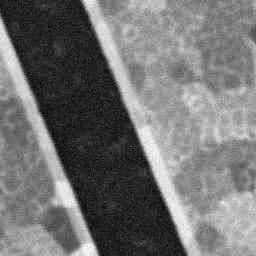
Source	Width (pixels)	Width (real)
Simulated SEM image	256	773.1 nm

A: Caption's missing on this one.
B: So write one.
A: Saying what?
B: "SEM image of one or a few lines or trenches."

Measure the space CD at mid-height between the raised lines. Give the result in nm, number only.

288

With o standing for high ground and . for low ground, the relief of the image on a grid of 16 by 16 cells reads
......oooooooooo
......oooooooooo
.......ooooooooo
o......ooooooooo
o......ooooooooo
o.......oooooooo
oo......oooooooo
oo.......ooooooo
ooo......ooooooo
ooo.......oooooo
ooo.......oooooo
oooo......oooooo
oooo.......ooooo
ooooo......ooooo
ooooo.......oooo
oooooo......oooo